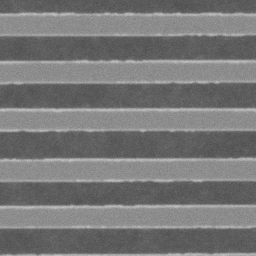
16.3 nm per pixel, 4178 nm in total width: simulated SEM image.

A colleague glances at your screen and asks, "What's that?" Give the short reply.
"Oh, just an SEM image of lines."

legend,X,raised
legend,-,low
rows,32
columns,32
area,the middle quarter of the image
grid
XXXXXXXXXXXXXXXXXXXXXXXXXXXXXXXX
XXXXXXXXXXXXXXXXXXXXXXXXXXXXXXXX
XXXXXXXXXXXXXXXXXXXXXXXXXXXXXXXX
XXXXXXXXXXXXXXXXXXXXXXXXXXXXXXXX
XXXXXXXXXXXXXXXXXXXXXXXXXXX-XXXX
--------------------------------
--------------------------------
--------------------------------
--------------------------------
--------------------------------
--------------------------------
----XX--------XX-X--XXX--XX-XXXX
XXXXXXXXXXXXXXXXXXXXXXXXXXXXXXXX
XXXXXXXXXXXXXXXXXXXXXXXXXXXXXXXX
XXXXXXXXXXXXXXXXXXXXXXXXXXXXXXXX
XXXXXXXXXXXXXXXXXXXXXXXXXXXXXXXX
XXXXXXXXXXXXXXXXXXXXXXXXXXXXXXXX
--------------------------------
--------------------------------
--------------------------------
--------------------------------
--------------------------------
--------------------------------
--------------------------------
XXXXXXXXXXXXXXXXXXXXXXXXXXXXXXXX
XXXXXXXXXXXXXXXXXXXXXXXXXXXXXXXX
XXXXXXXXXXXXXXXXXXXXXXXXXXXXXXXX
XXXXXXXXXXXXXXXXXXXXXXXXXXXXXXXX
XXXXXXXXXXXXXXXXXXXXXXXXXXXXXXXX
--------------------------------
--------------------------------
--------------------------------